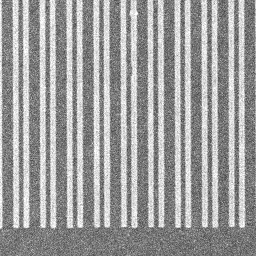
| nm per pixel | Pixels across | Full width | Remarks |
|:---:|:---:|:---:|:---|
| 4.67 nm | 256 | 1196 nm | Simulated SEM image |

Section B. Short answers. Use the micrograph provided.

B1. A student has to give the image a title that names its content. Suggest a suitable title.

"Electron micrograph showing parallel lines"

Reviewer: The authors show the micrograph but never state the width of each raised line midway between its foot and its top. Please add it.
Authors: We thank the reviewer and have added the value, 23.9 nanometres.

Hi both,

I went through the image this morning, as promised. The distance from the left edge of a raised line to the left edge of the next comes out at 0.062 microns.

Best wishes